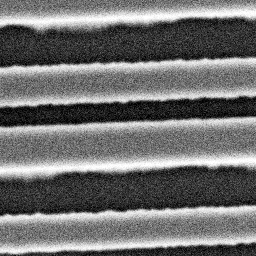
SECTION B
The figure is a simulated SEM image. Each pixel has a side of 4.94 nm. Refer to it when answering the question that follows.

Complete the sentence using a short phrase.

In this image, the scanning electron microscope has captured lines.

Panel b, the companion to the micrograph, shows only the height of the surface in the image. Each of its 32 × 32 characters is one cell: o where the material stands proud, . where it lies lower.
oooooooooooooooooooooooooooooooo
oooooooooooooooooooooooooooooooo
oooooooooooooo..................
................................
................................
................................
................................
.........................o.ooooo
.ooooooooooooooooooooooooooooooo
oooooooooooooooooooooooooooooooo
oooooooooooooooooooooooooooooooo
oooooooooooooooooooooooooooooooo
ooooooooooooooooo...............
................................
................................
...........ooooooooooooooooooooo
oooooooooooooooooooooooooooooooo
oooooooooooooooooooooooooooooooo
oooooooooooooooooooooooooooooooo
oooooooooooooooooooooooooooooooo
oooooooooooooooooooooo..........
ooooo...........................
................................
................................
................................
................................
.............oo.oooooooooooooooo
oooooooooooooooooooooooooooooooo
oooooooooooooooooooooooooooooooo
oooooooooooooooooooooooooooooooo
ooooooooooooooooooooooooooo.o...
ooo.............................